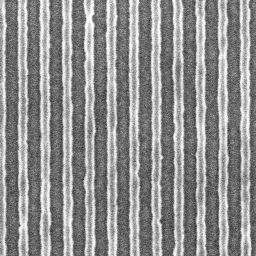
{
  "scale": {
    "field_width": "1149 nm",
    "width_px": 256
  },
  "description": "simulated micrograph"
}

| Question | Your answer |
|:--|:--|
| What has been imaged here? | parallel lines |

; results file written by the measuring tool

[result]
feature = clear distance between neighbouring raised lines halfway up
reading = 65.1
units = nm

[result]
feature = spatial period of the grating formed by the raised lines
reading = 0.0998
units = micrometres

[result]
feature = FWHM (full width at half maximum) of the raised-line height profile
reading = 7.75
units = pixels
